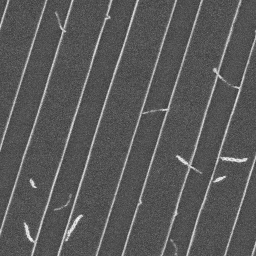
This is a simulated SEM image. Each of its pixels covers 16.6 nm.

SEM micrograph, one or a few lines or trenches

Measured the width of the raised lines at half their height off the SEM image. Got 617 nanometers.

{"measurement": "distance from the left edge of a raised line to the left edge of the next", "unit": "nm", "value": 1020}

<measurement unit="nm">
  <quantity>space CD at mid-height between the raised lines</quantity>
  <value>407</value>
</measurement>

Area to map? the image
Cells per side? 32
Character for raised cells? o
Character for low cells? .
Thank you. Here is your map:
.ooooo...ooooo...ooooo...ooooo..
.oooo....ooooo...ooooo...ooooo..
ooooo...ooooo...ooooo...ooooo...
ooooo...ooooo...ooooo...ooooo...
oooo....ooooo...ooooo...ooooo...
oooo...ooooo....oooo....oooo....
oooo...ooooo...ooooo...ooooo...o
ooo....ooooo...ooooo...ooooo...o
ooo...ooooo...ooooo....oooo....o
ooo...ooooo...ooooo...ooooo...oo
ooo...ooooo...ooooo...ooooo...oo
oo....oooo....oooo....ooooo...oo
oo...ooooo...ooooo...ooooo....oo
oo...ooooo...ooooo...ooooo...ooo
o....oooo....ooooo...ooooo...ooo
o...ooooo...ooooo...ooooo....ooo
o...ooooo...ooooo...ooooo...oooo
....ooooo...ooooo...ooooo...oooo
...ooooo...ooooo...ooooo....oooo
...ooooo...ooooo...ooooo...ooooo
...ooooo...ooooo...ooooo...ooooo
..ooooo....oooo....ooooo...oooo.
..ooooo...ooooo...ooooo...ooooo.
..ooooo...ooooo...ooooo...ooooo.
.ooooo....oooo....oooo....oooo..
.ooooo...ooooo...ooooo...ooooo..
.ooooo...ooooo...ooooo...ooooo..
ooooo....oooo....ooooo...ooooo..
ooooo...ooooo...ooooo...ooooo...
ooooo...ooooo...ooooo...ooooo...
oooo....oooo....ooooo...ooooo...
oooo...ooooo...ooooo....oooo....